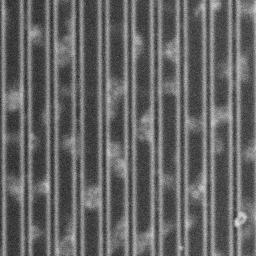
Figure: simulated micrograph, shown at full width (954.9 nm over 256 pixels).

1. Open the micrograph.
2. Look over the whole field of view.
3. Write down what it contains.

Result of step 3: parallel lines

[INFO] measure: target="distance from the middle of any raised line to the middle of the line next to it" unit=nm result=97.4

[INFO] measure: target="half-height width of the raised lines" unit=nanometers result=77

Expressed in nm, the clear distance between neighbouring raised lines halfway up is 21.